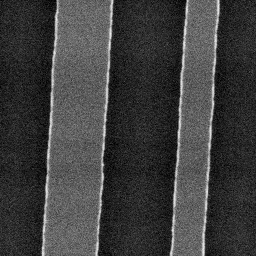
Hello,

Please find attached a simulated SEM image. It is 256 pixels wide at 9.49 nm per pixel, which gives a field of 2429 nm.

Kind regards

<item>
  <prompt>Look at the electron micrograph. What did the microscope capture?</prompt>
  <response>lines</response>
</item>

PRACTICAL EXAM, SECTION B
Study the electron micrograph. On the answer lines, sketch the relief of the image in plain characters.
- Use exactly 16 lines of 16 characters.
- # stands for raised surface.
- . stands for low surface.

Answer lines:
....###.....##..
...####.....##..
...####....###..
...####....##...
...####....##...
...####....##...
...####....##...
...####....##...
...####....##...
...###.....##...
...###.....##...
...###.....##...
...###.....##...
...###.....##...
...###.....##...
...###.....##...